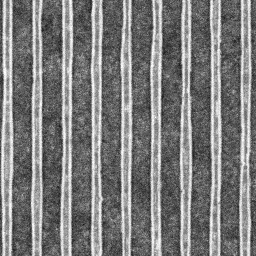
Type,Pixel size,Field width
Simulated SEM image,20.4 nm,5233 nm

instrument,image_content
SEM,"parallel lines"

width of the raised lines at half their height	143	nanometers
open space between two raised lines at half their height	0.465	microns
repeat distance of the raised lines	609	nanometers